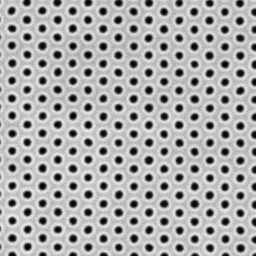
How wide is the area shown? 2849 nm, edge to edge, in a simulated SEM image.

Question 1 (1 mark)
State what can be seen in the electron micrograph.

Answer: a regular array of holes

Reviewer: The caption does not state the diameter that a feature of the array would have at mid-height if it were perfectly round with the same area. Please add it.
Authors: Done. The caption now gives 92.3 nanometers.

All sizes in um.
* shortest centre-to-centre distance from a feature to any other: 0.192